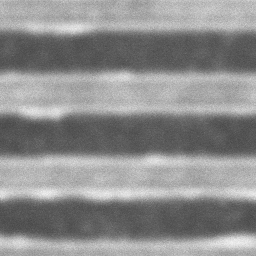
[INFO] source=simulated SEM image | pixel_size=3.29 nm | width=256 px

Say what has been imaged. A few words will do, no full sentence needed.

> one or a few lines or trenches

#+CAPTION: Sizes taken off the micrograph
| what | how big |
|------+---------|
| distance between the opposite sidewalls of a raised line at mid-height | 183 nm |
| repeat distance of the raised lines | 0.274 micrometres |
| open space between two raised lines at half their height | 91.7 nanometers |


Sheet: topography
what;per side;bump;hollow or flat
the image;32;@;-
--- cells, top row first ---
--------------------------------
--------------------------------
--------------------------------
@@@@@@@@@@@@@@@@@@@@@@@@@@@@@@@@
@@@@@@@@@@@@@@@@@@@@@@@@@@@@@@@@
@@@@@@@@@@@@@@@@@@@@@@@@@@@@@@@@
@@@@@@@@@@@@@@@@@@@@@@@@@@@@@@@@
@@@@@@@@@@@@@@@@@@@@@@@@@@@@@@@@
@@@@@@@@@@@@@@@@@@@@@@@@@@@@@@@@
@@@@@@@@@@@@@@@@@@@@@@@@@@@@@@@@
--------------------------------
--------------------------------
--------------------------------
--------------------------------
@@@@@@@@@@@@@@@@@@@@@@@@@@@@@@@@
@@@@@@@@@@@@@@@@@@@@@@@@@@@@@@@@
@@@@@@@@@@@@@@@@@@@@@@@@@@@@@@@@
@@@@@@@@@@@@@@@@@@@@@@@@@@@@@@@@
@@@@@@@@@@@@@@@@@@@@@@@@@@@@@@@@
@@@@@@@@@@@@@@@@@@@@@@@@@@@@@@@@
--------------------------------
--------------------------------
--------------------------------
--------------------------------
@@@@@@@@@@@@@@@@@@@@@@@@@@@@@@@@
@@@@@@@@@@@@@@@@@@@@@@@@@@@@@@@@
@@@@@@@@@@@@@@@@@@@@@@@@@@@@@@@@
@@@@@@@@@@@@@@@@@@@@@@@@@@@@@@@@
@@@@@@@@@@@@@@@@@@@@@@@@@@@@@@@@
@@@@@@@@@@@@@@@@@@@@@@@@@@@@@@@@
@@@@@@@@@@@@@@@@@@@@@@@@@@@@@@@@
--------------------------------